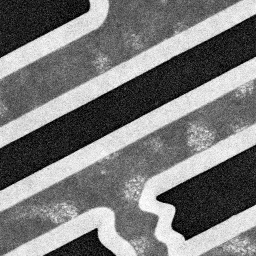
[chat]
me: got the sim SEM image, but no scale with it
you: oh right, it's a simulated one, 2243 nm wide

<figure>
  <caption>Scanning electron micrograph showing one or a few lines or trenches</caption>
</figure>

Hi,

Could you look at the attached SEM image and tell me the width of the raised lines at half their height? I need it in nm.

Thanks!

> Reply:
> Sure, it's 508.